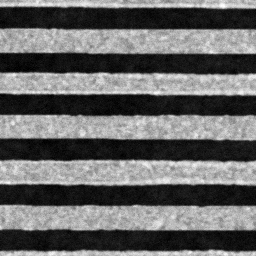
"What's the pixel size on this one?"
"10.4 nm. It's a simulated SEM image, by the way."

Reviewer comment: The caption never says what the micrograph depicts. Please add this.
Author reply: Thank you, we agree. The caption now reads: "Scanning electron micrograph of lines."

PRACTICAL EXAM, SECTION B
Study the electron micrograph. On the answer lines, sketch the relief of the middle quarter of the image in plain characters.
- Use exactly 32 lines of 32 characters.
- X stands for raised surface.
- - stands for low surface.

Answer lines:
--------------------------------
--------------------------------
--------------------------------
XXXXXXXXXXXXXXXXXXXXXXXXXXXXXXXX
XXXXXXXXXXXXXXXXXXXXXXXXXXXXXXXX
XXXXXXXXXXXXXXXXXXXXXXXXXXXXXXXX
XXXXXXXXXXXXXXXXXXXXXXXXXXXXXXXX
--------------------------------
--------------------------------
--------------------------------
--------------------------------
--------------------------------
--------------------------------
XXXXXXXXXXXXXXXXXXXXXXXXXXXXXXXX
XXXXXXXXXXXXXXXXXXXXXXXXXXXXXXXX
XXXXXXXXXXXXXXXXXXXXXXXXXXXXXXXX
XXXXXXXXXXXXXXXXXXXXXXXXXXXXXXXX
XXXXXXXXXXXXXXXXXXXXXXXXXXXXXXXX
------------XXXXXXXXXXXXXXXXXXXX
--------------------------------
--------------------------------
--------------------------------
--------------------------------
--------------------------------
XXXXXXXXXXXXXXXXXXXXXXXXXXX---X-
XXXXXXXXXXXXXXXXXXXXXXXXXXXXXXXX
XXXXXXXXXXXXXXXXXXXXXXXXXXXXXXXX
XXXXXXXXXXXXXXXXXXXXXXXXXXXXXXXX
XXXXXXXXXXXXXXXXXXXXXXXXXXXXXXXX
XXXXXXXXXXXXXXXXXXXXXXXXX--X-XXX
--------------------------------
--------------------------------